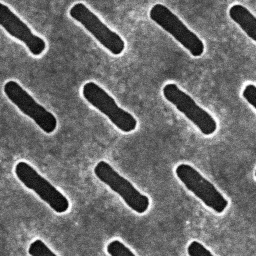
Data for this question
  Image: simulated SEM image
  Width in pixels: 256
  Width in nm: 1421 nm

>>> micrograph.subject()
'a regular array of holes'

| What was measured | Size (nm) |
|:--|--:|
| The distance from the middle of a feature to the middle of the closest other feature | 439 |